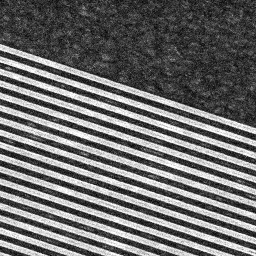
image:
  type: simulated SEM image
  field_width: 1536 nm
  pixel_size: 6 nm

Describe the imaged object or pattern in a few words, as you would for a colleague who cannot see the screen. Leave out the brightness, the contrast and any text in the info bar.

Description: parallel lines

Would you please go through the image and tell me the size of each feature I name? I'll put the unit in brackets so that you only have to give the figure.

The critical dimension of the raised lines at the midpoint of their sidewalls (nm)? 34.1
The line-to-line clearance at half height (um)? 0.0399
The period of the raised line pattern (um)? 0.0696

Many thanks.